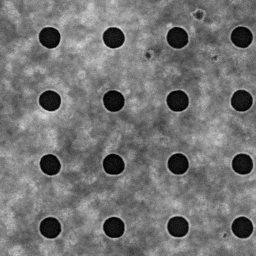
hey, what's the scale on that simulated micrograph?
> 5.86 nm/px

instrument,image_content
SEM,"a regular array of holes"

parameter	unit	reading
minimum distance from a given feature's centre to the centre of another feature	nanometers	369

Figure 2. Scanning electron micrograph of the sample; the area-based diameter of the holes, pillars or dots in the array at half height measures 129 nanometers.